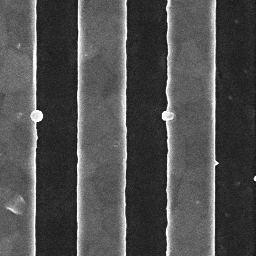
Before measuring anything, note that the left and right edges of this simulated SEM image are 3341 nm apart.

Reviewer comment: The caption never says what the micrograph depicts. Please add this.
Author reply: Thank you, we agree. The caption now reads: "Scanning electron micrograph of one or a few lines or trenches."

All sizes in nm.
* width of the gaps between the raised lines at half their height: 548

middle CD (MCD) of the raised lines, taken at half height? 628 nanometers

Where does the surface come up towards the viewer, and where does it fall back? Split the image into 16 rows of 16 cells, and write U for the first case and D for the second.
UUDDDUUUDDDUUDDD
UUDDDUUUDDDUUDDD
DUDDDUUUDDUUUDDD
UDDDDUUUDDUUUDDD
UUDDDUUUDDUUUDDD
UUDDDUUUDDUUUDDD
UUDDDUUUDDUUUDDD
UUDDDUUUDDUUUDDD
UUDDDUUUDDDUUDDD
UUDDDUUUDDDUUDDD
UUDDDUUUDDUUUDDD
UUDDDUUUDDDDUDDD
UUDDDUUUDDDUUDDD
UUDDDUUUDDDUUDDD
UUDDDUUUDDUUUDDD
UUDDDUUUDDDUUDDD